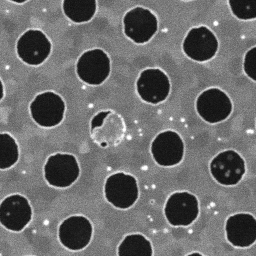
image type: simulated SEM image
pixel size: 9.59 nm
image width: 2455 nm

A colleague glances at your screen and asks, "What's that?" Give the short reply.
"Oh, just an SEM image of a regular array of holes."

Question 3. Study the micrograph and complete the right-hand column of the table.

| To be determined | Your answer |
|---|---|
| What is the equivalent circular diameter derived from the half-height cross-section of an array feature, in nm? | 335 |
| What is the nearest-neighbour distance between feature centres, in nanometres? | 598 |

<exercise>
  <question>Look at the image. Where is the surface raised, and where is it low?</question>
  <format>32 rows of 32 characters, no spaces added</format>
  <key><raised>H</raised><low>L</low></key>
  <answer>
HHHHHHHHLLLLHHHHHHHHHHHHHHHHHLLL
HHHHHHHHLLLLHHHHLLLHHHHHHHHHHLLL
HHHHHHHHHLLHHHHLLLLLHHHHHHHHHHHH
HHHHHHHHHHHHHHHLLLLLHHHHLLHHHHHH
HHHLLLHHHHHHHHHHLLLHHHHLLLLHHHHH
HHLLLLHHHHHHHHHHHHHHHHHLLLLHHHHH
HHLLLLHHHHHLLHHHHHHHHHHLLLLHHHHL
HHHLLLHHHHLLLLHHHHHHHHHHLLHHHHHL
HHHHHHHHHHLLLLHHHHHHHHHHHHHHHHLL
HHHHHHHHHHLLLHHHHLLLLHHHHHHHHHHL
HHHHHHHHHHHLLHHHHLLLLHHHHHHHHHHH
HHHHHHHHHHHHHHHHHLLLLHHHHLLLHHHH
HHHHLLLLHHHHHHHHHHLLHHHHHLLLLHHH
HHHHLLLLHHHHHHHHHHHHHHHHHLLLLHHH
HHHHLLLLHHHHLHHHHHHHHHHHHLLLLHHH
HHHHHLLHHHHLLHHHHHHHHHHHHHHHHHHH
HHHHHHHHHHHHHHHHHHHHLLHHHHHHHHHH
LLHHHHHHHHHHHHHHHHHLLLLHHHHHHHHH
LLHHHHHHHHHHHHHHHHHLLLLHHHHHHHHH
LLHHHHLLLHHHHHHHHHHLLLLHHHHLLLHH
LLHHHHLLLLHHHHHHHHHHLLHHHHLLLLLH
HHHHHHLLLLHHHHHHHHHHHHHHHHLLLLLH
HHHHHHLLLHHHHLLLLHHHHHHHHHHLLLHH
HHHHHHHHHHHHHLLLLHHHHHHHHHHHHHHH
HLLHHHHHHHHHHLLLLHHHHLLLHHHHHHHH
LLLLHHHHHHHHHHLLLHHHHLLLLHHHHHHH
LLLLHHHHHHHHHHHHHHHHHLLLLHHHHHHH
LLLLHHHHLLLHHHHHHHHHHLLLHHHHLLLL
HLLHHHHLLLLLHHHHHHHHHHHHHHHHLLLL
HHHHHHHLLLLHHHHHLLHHHHHHHHHHLLLL
HHHHHHHHLLLHHHHLLLLHHHHHHHHHHLLL
HHHHHHHHHHHHHHHLLLLHHHHHHHHHHHHH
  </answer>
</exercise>